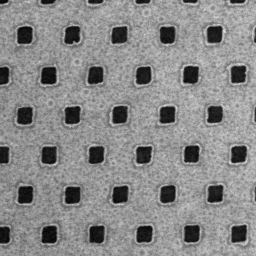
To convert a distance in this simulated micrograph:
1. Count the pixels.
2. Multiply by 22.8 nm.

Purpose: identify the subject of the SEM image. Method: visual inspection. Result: a regular array of holes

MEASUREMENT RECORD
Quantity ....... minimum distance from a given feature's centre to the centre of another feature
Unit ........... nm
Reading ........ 1050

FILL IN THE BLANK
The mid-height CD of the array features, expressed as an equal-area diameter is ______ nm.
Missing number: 418